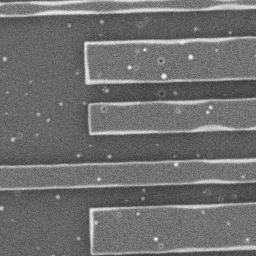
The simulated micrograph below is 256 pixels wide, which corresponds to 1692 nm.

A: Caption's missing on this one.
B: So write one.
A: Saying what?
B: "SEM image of groups of lines, slits or small figures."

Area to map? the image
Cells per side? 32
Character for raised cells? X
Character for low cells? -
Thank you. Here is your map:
XXXXXXXXXXXXXXXXXXXXXXXXXXXXXXXX
XXXXXXXXXXXXXXX-----------------
--------------------------------
--------------------------------
--------------------------------
-----------XXXXXXXXXXXXXXXXXXXXX
-----------XXXXXXXXXXXXXXXXXXXXX
-----------XXXXXXXXXXXXXXXXXXXXX
-----------XXXXXXXXXXXXXXXXXXXXX
-----------XXXXXXXXXXXXXXXXXXXXX
--------------------------------
--------------------------------
--------------------------XXXXXX
-----------XXXXXXXXXXXXXXXXXXXXX
-----------XXXXXXXXXXXXXXXXXXXXX
-----------XXXXXXXXXXXXXXXXXXXXX
-----------XXXXXXX-XX-----------
--------------------------------
--------------------------------
--------------------------------
--------------XXXXXXXXXXXXXXXXXX
XXXXXXXXXXXXXXXXXXXXXXXXXXXXXXXX
XXXXXXXXXXXXXXXXXXXXXXXXXXXXXXXX
XXXXXXXX------------------------
--------------------------------
------------------------------XX
-----------XXXXXXXXXXXXXXXXXXXXX
-----------XXXXXXXXXXXXXXXXXXXXX
-----------XXXXXXXXXXXXXXXXXXXXX
-----------XXXXXXXXXXXXXXXXXXXXX
-----------XXXXXXXXXXXXXXXXXXXXX
-----------XXXXXXXXXX-----------